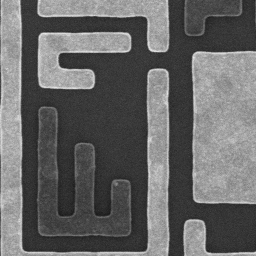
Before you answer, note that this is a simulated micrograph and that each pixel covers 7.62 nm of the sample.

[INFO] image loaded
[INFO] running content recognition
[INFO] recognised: wiring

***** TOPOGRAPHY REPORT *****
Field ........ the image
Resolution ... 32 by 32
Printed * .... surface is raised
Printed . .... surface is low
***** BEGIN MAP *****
***..****************..*******..
***..****************..*******..
***...............***..***......
***...............***..***......
***..***********..***...........
***..***********...**...........
***..***......................**
***..**.................********
***..***................********
***..*******.......**...********
***..*******......***...********
***...............***...********
***...............***...********
***..**...........***...********
***..**............**...********
***..**............**...********
***..**............**...********
***..**............**...********
***..**..***.......**...********
***..**..***.......**...********
***..**..***.......**...********
***..**..***.......**...********
***..**..***.......**...********
***..**..***..**...**...********
***..**..***..**...**...********
***..**..***..**..***...........
***..**..***..**..***...........
***..***********...**...........
***..***********...**..***......
***................**..***......
***................**..***......
****..............***..***......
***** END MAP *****